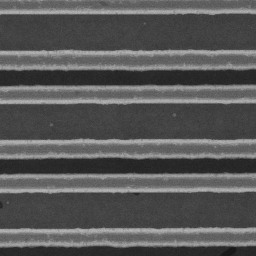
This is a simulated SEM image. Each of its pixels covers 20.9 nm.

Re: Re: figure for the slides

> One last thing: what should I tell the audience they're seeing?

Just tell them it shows lines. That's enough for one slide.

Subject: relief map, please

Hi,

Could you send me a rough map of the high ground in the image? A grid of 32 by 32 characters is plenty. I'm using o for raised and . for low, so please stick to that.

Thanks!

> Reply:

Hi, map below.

oooooooooooooooooooooooooooooooo
oooooooooooooooooooooooooooooooo
................................
................................
................................
................................
oooooooooooooooooooooooooooooooo
oooooooooooooooooooooooooooooooo
oooooooooooooooooooooooooooooooo
................................
................................
oooooooooooooooooooooooooooooooo
oooooooooooooooooooooooooooooooo
................................
................................
................................
................................
.................oooooooo.....oo
oooooooooooooooooooooooooooooooo
oooooooooooooooooooooooooooooooo
................................
................................
oooooooooooooooooooooooooooooooo
oooooooooooooooooooooooooooooooo
................................
................................
................................
................................
................................
oooooooooooooooooooooooooooooooo
oooooooooooooooooooooooooooooooo
................................